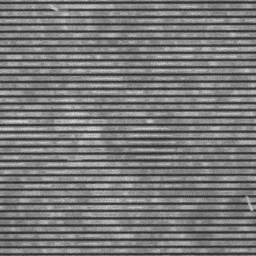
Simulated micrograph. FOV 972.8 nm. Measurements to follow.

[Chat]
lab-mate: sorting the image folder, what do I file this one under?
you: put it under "parallel lines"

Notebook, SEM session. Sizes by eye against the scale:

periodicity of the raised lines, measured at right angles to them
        27.3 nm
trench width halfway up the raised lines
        0.0095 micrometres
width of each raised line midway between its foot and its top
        19.5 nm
